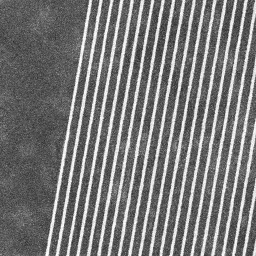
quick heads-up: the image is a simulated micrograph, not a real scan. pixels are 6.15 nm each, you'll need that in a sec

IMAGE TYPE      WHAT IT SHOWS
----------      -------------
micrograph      parallel lines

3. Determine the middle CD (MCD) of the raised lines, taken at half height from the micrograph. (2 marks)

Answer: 16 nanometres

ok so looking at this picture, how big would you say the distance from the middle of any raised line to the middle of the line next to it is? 62.8 nanometres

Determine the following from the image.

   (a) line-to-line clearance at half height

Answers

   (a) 0.047 micrometres